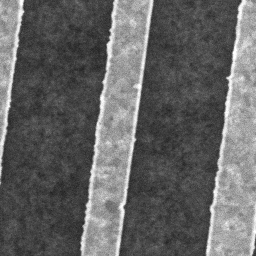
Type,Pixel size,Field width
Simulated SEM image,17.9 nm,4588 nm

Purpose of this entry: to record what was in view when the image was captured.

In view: one or a few lines or trenches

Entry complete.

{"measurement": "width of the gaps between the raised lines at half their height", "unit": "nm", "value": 1610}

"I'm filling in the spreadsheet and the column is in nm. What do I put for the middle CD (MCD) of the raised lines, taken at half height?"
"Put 626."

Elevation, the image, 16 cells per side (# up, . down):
#......##......#
#......##......#
#......##......#
#......##......#
#......##.....##
#......##.....##
#.....###.....##
......##......##
......##......##
......##......##
......##......##
......##......##
......##.....###
.....###.....###
.....###.....###
.....##......###